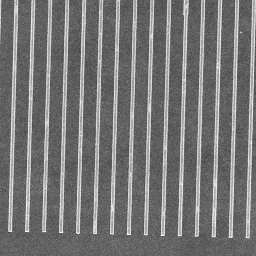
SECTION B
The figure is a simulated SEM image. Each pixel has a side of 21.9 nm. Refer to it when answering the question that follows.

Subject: parallel lines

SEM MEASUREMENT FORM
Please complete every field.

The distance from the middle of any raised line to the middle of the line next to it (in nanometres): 372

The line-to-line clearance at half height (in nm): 307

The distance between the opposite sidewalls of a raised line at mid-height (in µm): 0.0658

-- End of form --